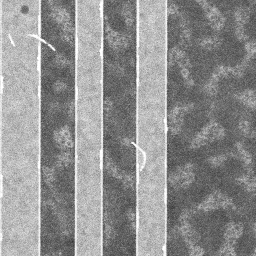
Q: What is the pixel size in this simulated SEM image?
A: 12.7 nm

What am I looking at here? one or a few lines or trenches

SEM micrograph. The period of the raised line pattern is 0.822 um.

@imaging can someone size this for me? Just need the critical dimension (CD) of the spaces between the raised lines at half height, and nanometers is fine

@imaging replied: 445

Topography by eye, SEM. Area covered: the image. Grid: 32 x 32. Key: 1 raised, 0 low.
11111000001110000111100000000000
11111000001110000111100000000000
11111000001110000111100000000000
11111000001110000111100000000000
11111000001110000111100000000000
11111000001110000111100000000000
11111000001110000111100000000000
11111000001110000111100000000000
11111000001110000111100000000000
11111000001110000111100000000000
11111000001110000111100000000000
11111000001110000111100000000000
11111000001110000111100000000000
11111000001110000111100000000000
11111000001110000111100000000000
11111000001110000111100000000000
11111000001110000111100000000000
11111000001110000111100000000000
11111000001110000111100000000000
11111000001110000111100000000000
11111000001110000111100000000000
11111000001110000111100000000000
11111000001110000111100000000000
11111000001110000111100000000000
11111000001110000111100000000000
11111000001110000111100000000000
11111000001110000111100000000000
11111000001110000111100000000000
11111000001110000111100000000000
11111000011110000111100000000000
11111000011110000111100000000000
11111000011110000111100000000000